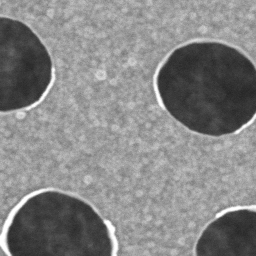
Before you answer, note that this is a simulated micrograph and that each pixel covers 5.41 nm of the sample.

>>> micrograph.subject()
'holes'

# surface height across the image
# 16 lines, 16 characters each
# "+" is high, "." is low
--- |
++++++++++++++++
..++++++++++++++
...+++++++++++++
...++++++++....+
...+++++++......
...+++++++......
..++++++++......
+++++++++++.....
+++++++++++++.++
++++++++++++++++
++++++++++++++++
++++++++++++++++
++...+++++++++++
+.....++++++++..
+......++++++...
+......+++++....